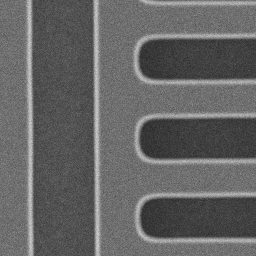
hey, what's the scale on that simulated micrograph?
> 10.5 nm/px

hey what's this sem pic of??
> groups of lines, slits or small figures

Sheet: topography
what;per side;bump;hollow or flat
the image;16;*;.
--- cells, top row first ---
**....**********
**....**********
**....***.......
**....***.......
**....***.......
**....**********
**....**********
**....***.......
**....***.......
**....***.......
**....**********
**....**********
**....***.......
**....***.......
**....***.......
**....**********